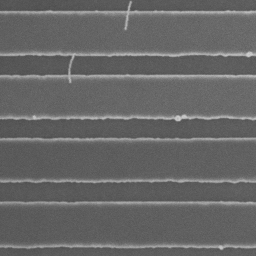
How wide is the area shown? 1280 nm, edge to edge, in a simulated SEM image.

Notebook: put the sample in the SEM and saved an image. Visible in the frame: lines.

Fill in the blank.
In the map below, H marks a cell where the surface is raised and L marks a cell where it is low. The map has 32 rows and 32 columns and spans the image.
LLLLLLLLLLLLLLLLLLLLLLLLLLLLLLLL
HHHHHHHHHHHHHHHHHHHHHHHHHHHHHHHH
HHHHHHHHHHHHHHHHHHHHHHHHHHHHHHHH
HHHHHHHHHHHHHHHHHHHHHHHHHHHHHHHH
HHHHHHHHHHHHHHHHHHHHHHHHHHHHHHHH
HHHHHHHHHHHHHHHHHHHHHHHHHHHHHHHH
HHHHHHHHHHHHHHHHHHHHHHHHHHHHHHHH
LLLLLLLLLLLLLLLLLLLLLLLLLLLLLLLL
LLLLLLLLLLLLLLLLLLLLLLLLLLLLLLLL
LLLLLHLLHHHHHHHHHHLLHHHHHHHHHHHL
HHHHHHHHHHHHHHHHHHHHHHHHHHHHHHHH
HHHHHHHHHHHHHHHHHHHHHHHHHHHHHHHH
HHHHHHHHHHHHHHHHHHHHHHHHHHHHHHHH
HHHHHHHHHHHHHHHHHHHHHHHHHHHHHHHH
HHHHHHHHHHHHHHHHHHHHHHHHHHHHHHHH
LLLLLLLLLLLLLLLLLLLLLLLLLLLLLLLL
LLLLLLLLLLLLLLLLLLLLLLLLLLLLLLLL
HHHHHHHHHHHHHHHHHHHHHHHHHHHHHHHH
HHHHHHHHHHHHHHHHHHHHHHHHHHHHHHHH
HHHHHHHHHHHHHHHHHHHHHHHHHHHHHHHH
HHHHHHHHHHHHHHHHHHHHHHHHHHHHHHHH
HHHHHHHHHHHHHHHHHHHHHHHHHHHHHHHH
HHHHHHHHHHHHHHHHHHHHHHHHHHHHHHHH
LLLLLLLLLLLLLLLLLLLLLLLLLLLLLLLL
LLLLLLLLLLLLLLLLLLLLLLLLLLLLLLLL
HHHHHHHHHHHHHHHHHHHHHHHHHHHHHHHH
HHHHHHHHHHHHHHHHHHHHHHHHHHHHHHHH
HHHHHHHHHHHHHHHHHHHHHHHHHHHHHHHH
HHHHHHHHHHHHHHHHHHHHHHHHHHHHHHHH
HHHHHHHHHHHHHHHHHHHHHHHHHHHHHHHH
HHHHHHHHHHHHHHHHHHHHHHHHHHHHHHHH
LLLLLLLLLLLLLLLLLLLLLLLLLLLLLLLL